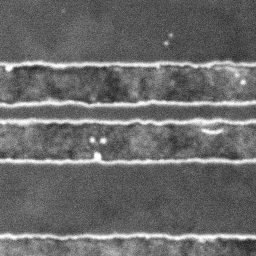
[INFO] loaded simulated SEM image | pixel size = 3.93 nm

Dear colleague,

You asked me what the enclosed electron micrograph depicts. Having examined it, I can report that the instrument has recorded lines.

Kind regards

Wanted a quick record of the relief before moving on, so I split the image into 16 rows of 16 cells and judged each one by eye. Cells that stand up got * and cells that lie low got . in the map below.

****************
****************
****************
****************
..........*.....
................
.***************
****************
................
................
****************
****************
****************
****************
****************
................